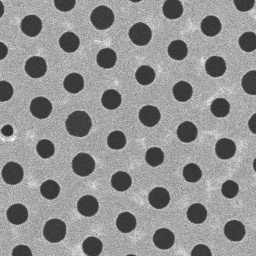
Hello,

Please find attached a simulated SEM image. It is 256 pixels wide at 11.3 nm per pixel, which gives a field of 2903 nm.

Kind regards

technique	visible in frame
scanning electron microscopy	a regular array of holes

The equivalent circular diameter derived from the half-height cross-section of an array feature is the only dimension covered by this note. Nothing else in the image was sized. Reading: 244 nm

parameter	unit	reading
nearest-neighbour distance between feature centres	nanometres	463